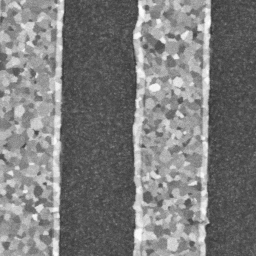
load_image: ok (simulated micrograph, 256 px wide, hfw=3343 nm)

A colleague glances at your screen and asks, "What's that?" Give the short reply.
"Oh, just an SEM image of one or a few lines or trenches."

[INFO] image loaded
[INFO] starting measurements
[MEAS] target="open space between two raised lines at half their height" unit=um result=1.06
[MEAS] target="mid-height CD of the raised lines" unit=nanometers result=865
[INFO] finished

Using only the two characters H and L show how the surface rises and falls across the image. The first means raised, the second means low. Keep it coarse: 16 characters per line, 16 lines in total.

HHHHLLLLLHHHHLLL
HHHHLLLLLHHHHLLL
HHHHLLLLLHHHHLLL
HHHHLLLLLHHHHLLL
HHHHLLLLLHHHHLLL
HHHHLLLLLHHHHLLL
HHHHLLLLLHHHHLLL
HHHHLLLLLHHHHLLL
HHHHLLLLLHHHHLLL
HHHHLLLLLHHHHLLL
HHHHLLLLLHHHHLLL
HHHHLLLLLHHHHLLL
HHHHLLLLLHHHHLLL
HHHHLLLLLHHHHLLL
HHHLLLLLLHHHHLLL
HHHLLLLLLHHHHLLL